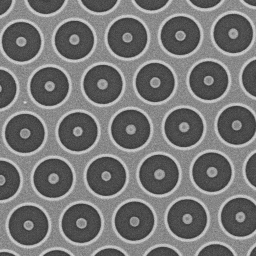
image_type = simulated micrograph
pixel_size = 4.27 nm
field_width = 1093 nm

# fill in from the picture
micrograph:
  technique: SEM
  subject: an array of small figures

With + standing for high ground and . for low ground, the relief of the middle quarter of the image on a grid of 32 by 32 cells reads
+++++++.....++++++++......++++++
++++++.......++++++........+++++
+++++.........++++.........++++.
.++++..........+++..........+++.
..++.....+.....+++....++....+++.
..+++....+.....+++....++....+++.
.++++..........+++..........++++
.++++.........+++++........+++++
++++++........++++++......++++++
+++++++.....+++++++++...++++++++
++++++++++++++++++++++++++++++++
+++++++++++++++...+++++++++.....
+.....+++++++.......++++++......
........++++.........++++.......
........++++.........++++.......
.........+++..........+++....++.
...+.....+++....+.....+++.......
...+.....+++..........+++.......
........++++.........+++++......
........+++++........+++++......
.......+++++++......+++++++.....
+.....++++++++++..++++++++++++++
++++++++++++++++++++++...+++++++
++++++++.....+++++++.......+++++
.++++++.......++++++........++++
..++++.........++++..........+++
..++++..........+++..........+++
..+++.....+.....+++....+.....+++
...++.....+.....+++..........+++
..++++..........+++..........+++
..++++.........++++.........++++
..+++++........+++++.......+++++